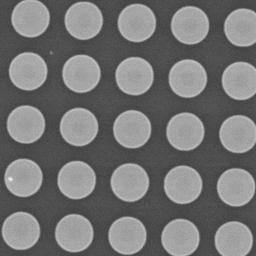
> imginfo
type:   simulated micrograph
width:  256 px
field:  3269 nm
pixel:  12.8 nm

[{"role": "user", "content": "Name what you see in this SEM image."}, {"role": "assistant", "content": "an array of small figures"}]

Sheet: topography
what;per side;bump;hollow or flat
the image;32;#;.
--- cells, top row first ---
..###....###....................
..####..#####..####...###....###
..####..#####..####...####..####
..####..#####..####..#####..####
...##....###...####...####..####
.......................#.....###
................................
..###....###....##..............
.#####..####...####...###...####
.#####..####...####..#####..####
..###...####...####..#####..####
..........#.....##....###...####
................................
..##............................
.####...####...###....##.....#..
.#####..####..#####..####...####
.####...####..#####..####...####
..###...####...###...####...####
......................##....###.
................................
.###....###.....#...............
.####..#####..####...####...###.
.####..#####..#####..####..#####
.####..#####..####...####..#####
..#.....###....###...####..#####
.............................##.
................................
.####...###....##.....#.........
#####..#####..####...####..####.
#####..#####..####..#####..#####
.###...####...####..#####..####.
...............##....###...####.